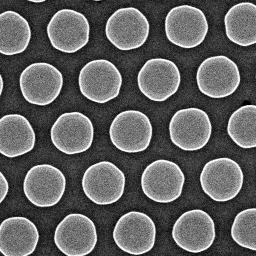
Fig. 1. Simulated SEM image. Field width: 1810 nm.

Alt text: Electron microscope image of an array of small figures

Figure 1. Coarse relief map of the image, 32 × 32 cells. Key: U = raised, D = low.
DDDDDDDDDDDDDDDDDDDDDDDDDDDDDDUD
DUDDDDDUUDDDDDUUUDDDDUUUUDDDDUUU
UUUDDDUUUUUDDDUUUUDDDUUUUUDDUUUU
UUUUDDUUUUUDDUUUUUUDDUUUUUDDUUUU
UUUUDDUUUUUDDUUUUUDDDUUUUUDDDUUU
UUUDDDDUUUUDDDUUUUDDDDUUUDDDDDUD
UUDDDDDDDDDDDDDDDDDDDDDDDDDDDDDD
DDDDDDDDDDDDDDDDDDDUUDDDDDUUUDDD
DDDUUUUDDDUUUUDDDDUUUUDDDUUUUUDD
DDDUUUUUDDUUUUUDDUUUUUDDDUUUUUDD
DDDUUUUUDDUUUUUDDUUUUUDDDUUUUUDD
DDDUUUUDDDUUUUUDDDUUUUDDDUUUUDDD
DDDUUUUDDDDDUUDDDDDUDDDDDDDDDDDD
DDDDDDDDDDDDDDDDDDDDDDDDDDDDDDUU
DUUDDDDDUUUDDDDUUUDDDDUUUUDDDUUU
UUUUDDDUUUUDDDUUUUUDDUUUUUDDDUUU
UUUUDDUUUUUUDDUUUUUDDUUUUUDDDUUU
UUUUDDDUUUUUDDUUUUUDDDUUUUDDDUUU
UUUUDDDUUUUDDDDUUUDDDDDUUDDDDDDD
DUDDDDDDDDDDDDDDDDDDDDDDDDDDDDDD
DDDDDDDDDDDDUUDDDDDUUUDDDDUUUUDD
DDDDUUUUDDDUUUUDDDUUUUUDDUUUUUDD
UDDUUUUUDDUUUUUUDDUUUUUDDUUUUUDD
UDDUUUUUDDUUUUUDDDUUUUUDDUUUUUDD
UDDUUUUUDDDUUUUDDDUUUUDDDDUUUDDD
DDDDUUUDDDDDDDDDDDDDDDDDDDDDDDDD
DDDDDDDDDDDDDDDDDDDDDDDUUDDDDDUU
DUUUDDDDUUUDDDDUUUUDDDUUUUDDDUUU
UUUUDDDUUUUUDDUUUUUDDDUUUUUDDUUU
UUUUUDDUUUUUDDUUUUUDDDUUUUUDDUUU
UUUUUDDUUUUUDDDUUUUDDDUUUUDDDDUU
UUUUDDDDUUUDDDDDUUDDDDDDDDDDDDDD